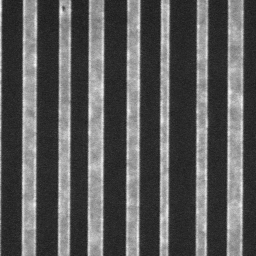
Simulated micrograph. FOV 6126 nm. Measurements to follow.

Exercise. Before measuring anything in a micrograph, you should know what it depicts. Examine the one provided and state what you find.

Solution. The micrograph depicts parallel lines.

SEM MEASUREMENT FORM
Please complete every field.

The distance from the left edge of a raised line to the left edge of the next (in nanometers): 821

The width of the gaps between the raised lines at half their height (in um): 0.543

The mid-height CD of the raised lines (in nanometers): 278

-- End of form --